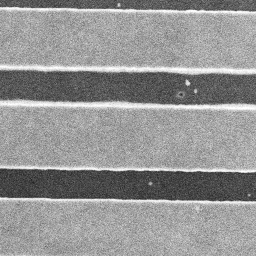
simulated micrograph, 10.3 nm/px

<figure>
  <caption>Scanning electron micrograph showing lines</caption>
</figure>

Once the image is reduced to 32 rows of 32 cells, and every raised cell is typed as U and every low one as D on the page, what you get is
DDDDDDDDDDDDDDDDDDDDDDDDDDDDDDDD
UUUUUUUUUUUUUUUUUUUUUUUUUUUUUUUD
UUUUUUUUUUUUUUUUUUUUUUUUUUUUUUUU
UUUUUUUUUUUUUUUUUUUUUUUUUUUUUUUU
UUUUUUUUUUUUUUUUUUUUUUUUUUUUUUUU
UUUUUUUUUUUUUUUUUUUUUUUUUUUUUUUU
UUUUUUUUUUUUUUUUUUUUUUUUUUUUUUUU
UUUUUUUUUUUUUUUUUUUUUUUUUUUUUUUU
DDDDUUUUUUUUUUUUUUUUUUUUUUUUUUUU
DDDDDDDDDDDDDDDDDDDDDDDDDDDDDDDD
DDDDDDDDDDDDDDDDDDDDDDDDDDDDDDDD
DDDDDDDDDDDDDDDDDDDDDDDDDDDDDDDD
DDDDDDDDDDDDDDDDDDDDDDDDDDDDDDDD
UUUUUUUUUUUUUUUUUUUUUUUUUUUUUUUU
UUUUUUUUUUUUUUUUUUUUUUUUUUUUUUUU
UUUUUUUUUUUUUUUUUUUUUUUUUUUUUUUU
UUUUUUUUUUUUUUUUUUUUUUUUUUUUUUUU
UUUUUUUUUUUUUUUUUUUUUUUUUUUUUUUU
UUUUUUUUUUUUUUUUUUUUUUUUUUUUUUUU
UUUUUUUUUUUUUUUUUUUUUUUUUUUUUUUU
UUUUUUUUUUUUUUUUUUUUUUUUUUUUUUUU
DDDDDDDDDDDDDDDDDDDDDDDDDDDDDDDD
DDDDDDDDDDDDDDDDDDDDDDDDDDDDDDDD
DDDDDDDDDDDDDDDDDDDDDDDDDDDDDDDD
DDDDDDDDDDDDDDDDDDDDDDDDDDDDDDDD
UUUUUUUUUUUUUUUUUUUUUUUUUUUUUUUU
UUUUUUUUUUUUUUUUUUUUUUUUUUUUUUUU
UUUUUUUUUUUUUUUUUUUUUUUUUUUUUUUU
UUUUUUUUUUUUUUUUUUUUUUUUUUUUUUUU
UUUUUUUUUUUUUUUUUUUUUUUUUUUUUUUU
UUUUUUUUUUUUUUUUUUUUUUUUUUUUUUUU
UUUUUUUUUUUUUUUUUUUUUUUUUUUUUUUU